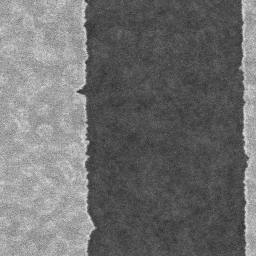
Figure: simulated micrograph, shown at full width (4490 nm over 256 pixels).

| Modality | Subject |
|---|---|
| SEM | one or a few lines or trenches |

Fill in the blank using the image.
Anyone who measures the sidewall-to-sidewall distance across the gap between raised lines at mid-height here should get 2780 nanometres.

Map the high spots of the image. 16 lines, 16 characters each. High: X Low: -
XXXXX----------X
XXXXX----------X
XXXXX----------X
XXXXX----------X
XXXXX----------X
XXXXX----------X
XXXXX----------X
XXXXX----------X
XXXXX----------X
XXXXX----------X
XXXXX----------X
XXXXX----------X
XXXXX----------X
XXXXXX---------X
XXXXXX---------X
XXXXX----------X